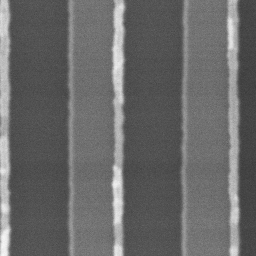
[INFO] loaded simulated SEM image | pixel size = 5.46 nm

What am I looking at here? lines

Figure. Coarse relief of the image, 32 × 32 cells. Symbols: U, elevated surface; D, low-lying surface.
UDDDDDDDDUUUUUUDDDDDDDDUUUUUUUDD
UDDDDDDDDUUUUUUDDDDDDDDUUUUUUUDD
UDDDDDDDDUUUUUUDDDDDDDDUUUUUUUDD
UDDDDDDDDUUUUUUDDDDDDDDUUUUUUUDD
UDDDDDDDDUUUUUUDDDDDDDDUUUUUUUDD
UDDDDDDDDUUUUUUDDDDDDDDUUUUUUUDD
UDDDDDDDDUUUUUUDDDDDDDDUUUUUUUDD
UDDDDDDDDUUUUUUDDDDDDDDUUUUUUUDD
UDDDDDDDDUUUUUUDDDDDDDDUUUUUUUDD
UDDDDDDDDUUUUUUDDDDDDDDUUUUUUDDD
UDDDDDDDDUUUUUUDDDDDDDDUUUUUUDDD
UDDDDDDDDUUUUUUDDDDDDDDUUUUUUUDD
UDDDDDDDDUUUUUUDDDDDDDDUUUUUUUDD
UDDDDDDDDUUUUUUDDDDDDDDUUUUUUUDD
UDDDDDDDDUUUUUUDDDDDDDDUUUUUUUDD
UDDDDDDDDUUUUUUDDDDDDDDUUUUUUUDD
UDDDDDDDDUUUUUUDDDDDDDDUUUUUUUDD
UDDDDDDDDUUUUUUDDDDDDDDUUUUUUUDD
UDDDDDDDDUUUUUUDDDDDDDDUUUUUUUDD
UDDDDDDDDUUUUUUDDDDDDDDUUUUUUUDD
UDDDDDDDDUUUUUUDDDDDDDDUUUUUUUDD
UDDDDDDDDUUUUUUDDDDDDDDUUUUUUUDD
UDDDDDDDDUUUUUUDDDDDDDDUUUUUUUDD
UDDDDDDDDUUUUUUDDDDDDDDUUUUUUUDD
UDDDDDDDDUUUUUUDDDDDDDDUUUUUUUDD
UDDDDDDDDUUUUUUDDDDDDDDUUUUUUUDD
UDDDDDDDDUUUUUUDDDDDDDDUUUUUUUDD
UDDDDDDDDUUUUUUDDDDDDDDUUUUUUUDD
UDDDDDDDDUUUUUUDDDDDDDDUUUUUUUDD
UDDDDDDDDUUUUUUDDDDDDDDUUUUUUUDD
UDDDDDDDDUUUUUUDDDDDDDDUUUUUUUDD
UDDDDDDDDUUUUUUDDDDDDDDUUUUUUUDD